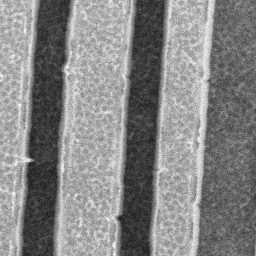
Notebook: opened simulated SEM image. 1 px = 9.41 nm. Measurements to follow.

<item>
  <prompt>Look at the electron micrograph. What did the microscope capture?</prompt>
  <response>one or a few lines or trenches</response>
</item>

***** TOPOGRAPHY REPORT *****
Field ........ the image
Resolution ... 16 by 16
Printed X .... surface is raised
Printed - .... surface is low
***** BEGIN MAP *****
XX---XXX--XXX---
XX--XXXX--XXX---
XX--XXXX--XXX---
XX--XXXX--XXX---
XX--XXXX--XXX---
XX--XXXX--XXX---
XX--XXXX--XXX---
XX--XXXX--XXX---
XX--XXXX--XXX---
XX--XXXX--XXX---
XX--XXXX--XXX---
XX--XXXX--XX----
X---XXXX--XX----
X---XXX---XX----
X---XXX---XX----
X---XXX---XX----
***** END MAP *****